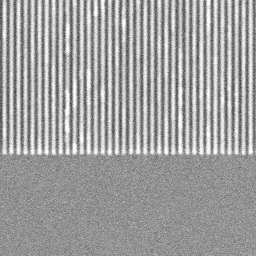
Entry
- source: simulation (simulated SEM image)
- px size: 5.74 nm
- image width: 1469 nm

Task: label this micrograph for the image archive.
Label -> parallel lines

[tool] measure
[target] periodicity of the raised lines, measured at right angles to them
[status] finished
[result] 0.0404 um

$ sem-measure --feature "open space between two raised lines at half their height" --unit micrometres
0.0251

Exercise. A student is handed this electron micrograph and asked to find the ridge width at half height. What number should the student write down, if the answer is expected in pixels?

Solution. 2.63